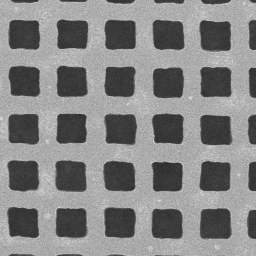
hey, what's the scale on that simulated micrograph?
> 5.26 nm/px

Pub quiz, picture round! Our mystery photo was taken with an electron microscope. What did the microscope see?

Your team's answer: a regular array of holes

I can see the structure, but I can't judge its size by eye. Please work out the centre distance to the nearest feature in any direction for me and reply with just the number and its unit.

0.246 microns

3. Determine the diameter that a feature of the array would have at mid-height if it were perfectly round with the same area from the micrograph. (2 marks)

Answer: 32.6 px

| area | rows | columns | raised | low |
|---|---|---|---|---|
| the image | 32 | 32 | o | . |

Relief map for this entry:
ooooooooooooooo.oooooooooo.ooooo
oooooooooooooooooooooooooooooooo
oooooooooooooooooooooooooooooooo
o....oo....oo....oo....oo....oo.
o....oo....oo....oo....oo....oo.
o....oo....oo....oo....oo....oo.
oooooooooooooooooooooooooooooooo
oooooooooooooooooooooooooooooooo
oo..ooo...oooo...ooooooooo..oooo
o....oo....oo....oo....oo....oo.
o....oo....oo....oo....oo....oo.
o....oo....oo....oo....oo....oo.
oooooooooooooooooooooooooooooooo
oooooooooooooooooooooooooooooooo
o....oo...ooo....oo....oo...oooo
o....oo....oo....oo....oo....oo.
o....oo....oo....oo....oo....oo.
o....oo....oo....oo....oo....oo.
oooooooooooooooooooooooooooooooo
oooooooooooooooooooooooooooooooo
o....oo...ooo...ooo...ooo....oo.
o....oo....oo....oo....oo....oo.
o....oo....oo....oo....oo....oo.
o...ooo....oo....oo....oo...ooo.
oooooooooooooooooooooooooooooooo
oooooooooooooooooooooooooooooooo
o....oo....oo....oo...ooo....oo.
o....oo....oo....oo....oo....oo.
o....oo....oo....oo....oo....oo.
o....oo...oooo..ooo....oo....oo.
oooooooooooooooooooooooooooooooo
oooooooooooooooooooooooooooooooo